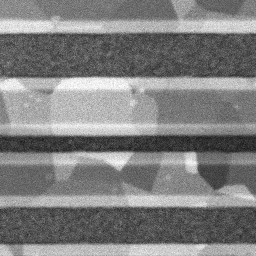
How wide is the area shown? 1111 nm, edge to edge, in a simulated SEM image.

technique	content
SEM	one or a few lines or trenches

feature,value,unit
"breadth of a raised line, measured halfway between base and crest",188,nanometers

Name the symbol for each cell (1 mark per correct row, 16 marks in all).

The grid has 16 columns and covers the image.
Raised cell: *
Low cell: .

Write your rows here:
****************
****************
................
................
................
****************
****************
****************
................
................
****************
****************
****************
................
................
................